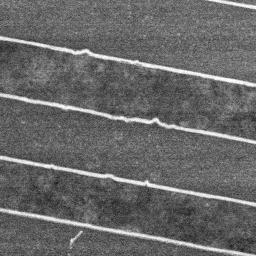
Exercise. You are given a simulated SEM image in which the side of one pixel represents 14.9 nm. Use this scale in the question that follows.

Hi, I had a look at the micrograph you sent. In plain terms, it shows one or a few lines or trenches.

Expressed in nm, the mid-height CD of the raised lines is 790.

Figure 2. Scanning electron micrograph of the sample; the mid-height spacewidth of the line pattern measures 919 nm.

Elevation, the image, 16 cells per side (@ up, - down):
----------------
----------------
@---------------
@@@@@@----------
@@@@@@@@@@@@----
@@@@@@@@@@@@@@@@
---@@@@@@@@@@@@@
--------@@@@@@@@
--------------@@
----------------
@@@@------------
@@@@@@@@@-------
@@@@@@@@@@@@@@--
--@@@@@@@@@@@@@@
-------@@@@@@@@@
-------------@@@